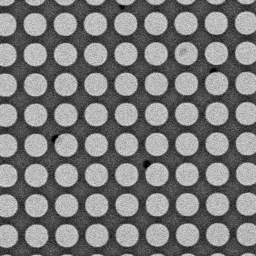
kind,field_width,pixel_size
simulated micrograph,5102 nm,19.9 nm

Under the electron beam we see an array of small figures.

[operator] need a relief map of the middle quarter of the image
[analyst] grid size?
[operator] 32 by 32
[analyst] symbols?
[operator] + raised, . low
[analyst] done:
................................
................................
+......++.....+++.....++.....+++
+++...++++...+++++...++++...++++
+++..++++++..+++++..++++++..++++
+++..++++++..+++++..++++++..++++
+++...++++...+++++...++++...++++
++....+++.....+++.....++.....+++
................................
................................
++....++++....+++....++++....+++
+++..++++++..+++++..++++++..++++
+++..++++++..+++++..++++++..++++
+++..++++++..+++++..++++++..++++
+++...++++...+++++...++++....+++
+...............................
................................
...............++.....++......++
+++...++++...+++++...++++...++++
+++..++++++..+++++..++++++..++++
+++..++++++..+++++..++++++..++++
+++...++++...+++++...+++++..++++
++....++++....+++.....+++....+++
................................
................................
++.....+++....+++....++++....+++
+++...+++++..+++++...+++++..++++
+++..++++++..+++++...+++++..++++
+++..++++++..+++++...+++++..++++
+++...++++....++++...++++....+++
+...............................
................................